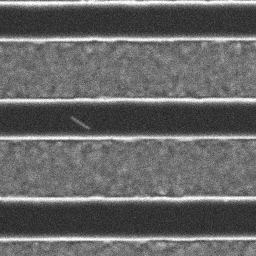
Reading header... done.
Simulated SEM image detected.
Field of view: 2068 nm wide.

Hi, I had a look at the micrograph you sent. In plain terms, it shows lines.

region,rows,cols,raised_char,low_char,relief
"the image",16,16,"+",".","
++++++++++++++++
++++++++++++++++
+++++...........
................
................
................
++++++++++++++++
++++++++++++++++
++++++++++++++++
................
................
................
++++++++++++++++
++++++++++++++++
++++++++++++++++
................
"